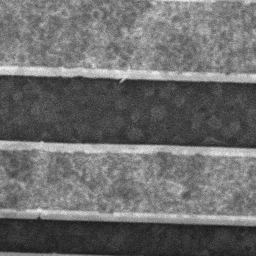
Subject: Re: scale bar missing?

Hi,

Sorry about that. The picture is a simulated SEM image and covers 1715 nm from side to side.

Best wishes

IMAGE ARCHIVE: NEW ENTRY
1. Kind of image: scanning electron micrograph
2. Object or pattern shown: one or a few lines or trenches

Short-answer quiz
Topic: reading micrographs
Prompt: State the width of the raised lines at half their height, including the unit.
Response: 0.468 micrometres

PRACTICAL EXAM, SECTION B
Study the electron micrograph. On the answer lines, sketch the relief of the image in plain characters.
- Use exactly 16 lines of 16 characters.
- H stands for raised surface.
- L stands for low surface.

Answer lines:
HHHHHHHHHHHHHHHH
HHHHHHHHHHHHHHHH
HHHHHHHHHHHHHHHH
HHHHHHHHHHHHHHHH
LLHHHHHHHHHHHHHH
LLLLLLLLLLLLLLLL
LLLLLLLLLLLLLLLL
LLLLLLLLLLLLLLLL
LLLLLLLLLLLLLLLL
HHHHHHHHHHHHHHHH
HHHHHHHHHHHHHHHH
HHHHHHHHHHHHHHHH
HHHHHHHHHHHHHHHH
LLLHHHHHHHHHHHHH
LLLLLLLLLLLLLLLL
LLLLLLLLLLLLLLLL